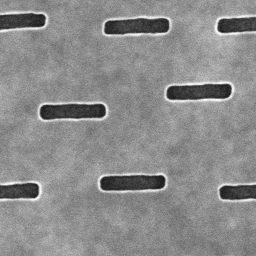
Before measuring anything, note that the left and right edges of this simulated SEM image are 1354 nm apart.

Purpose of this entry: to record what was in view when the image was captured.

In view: holes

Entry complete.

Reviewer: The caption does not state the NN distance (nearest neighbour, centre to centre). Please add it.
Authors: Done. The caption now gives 485 nanometres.